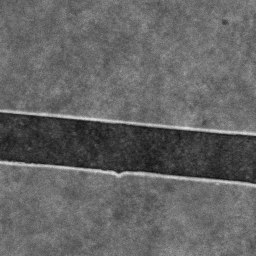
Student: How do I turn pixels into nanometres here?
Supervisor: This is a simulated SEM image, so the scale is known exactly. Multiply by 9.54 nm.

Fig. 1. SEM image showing one or a few lines or trenches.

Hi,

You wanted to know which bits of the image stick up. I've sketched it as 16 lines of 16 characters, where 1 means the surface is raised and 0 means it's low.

1111111111111111
1111111111111111
1111111111111111
1111111111111111
1111111111111111
1111111111111111
1111111111111111
0000001111111111
0000000000000000
0000000000000000
1111000000000000
1111111111111110
1111111111111111
1111111111111111
1111111111111111
1111111111111111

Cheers